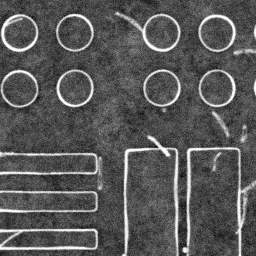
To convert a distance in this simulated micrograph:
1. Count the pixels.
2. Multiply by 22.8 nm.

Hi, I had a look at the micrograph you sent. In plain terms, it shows groups of lines, slits or small figures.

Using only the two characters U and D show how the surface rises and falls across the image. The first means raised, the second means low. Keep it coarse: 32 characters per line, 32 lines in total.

DDDDDDDDDDDDDDDDDDDDDDDDDDDDDDDD
DDDDDDDDDDDDDDDDDDDDDDDDDDDDDDDD
DUUUDDDDUUUDDDDDDDDUUUDDDDUUDDDD
UUUUUDDUUUUDDDDDDDUUUUDDDUUUUDDD
UUUUUDDUUUUDDDDDDDUUUUDDDUUUUDDD
DUUUDDDDUUUDDDDDDDDUUUDDDUUUUDDD
DDDDDDDDDDDDDDDDDDDDDDDDDDDDDDDD
DDDDDDDDDDDDDDDDDDDDDDDDDDDDDDDD
DDDDDDDDDDDDDDDDDDDDDDDDDDDDDDDD
DUUUDDDDUUUDDDDDDDDUUUDDDDUUUDDD
UUUUUDDUUUUDDDDDDDUUUUDDDUUUUDDD
UUUUUDDUUUUDDDDDDDUUUUDDDUUUUDDD
DUUUDDDDUUUDDDDDDDDUUUDDDDUUUDDD
DDDDDDDDDDDDDDDDDDDDDDDDDDDDDDDD
DDDDDDDDDDDDDDDDDDDDDDDDDDDDDDDD
DDDDDDDDDDDDDDDDDDDDDDDDDDDDDDDD
DDDDDDDDDDDDDDDDDDDDDDDDDDDDDDDD
DDDDDDDDDDDDDDDDDDDDDDDDDDDDDDDD
DDDDDDDDDDDDDDDDDDDUUDDDDDDDDDDD
UUUUUUUUUUUUDDDDUUUUUUDDUUUUUUDD
UUUUUUUUUUUUDDDDUUUUUUDDUUUUUUDD
UUUUUUUUUUUUDDDDUUUUUUDDUUUUUUDD
DDDDDDDDDDDDDDDDUUUUUUDDUUUUUUDD
DDDDDDDDDDDDDDDDUUUUUUDDUUUUUUDD
UUUUUUUUUUUUDDDDUUUUUUDDUUUUUUDD
UUUUUUUUUUUUDDDDUUUUUUDDUUUUUUDD
DDDDDDDDDDDDDDDDUUUUUUDDUUUUUUDD
DDDDDDDDDDDDDDDDUUUUUUDDUUUUUUDD
DDDDDDDDDDDDDDDDUUUUUUDDUUUUUUDD
UUUUUUUUUUUUDDDDUUUUUUDDUUUUUUDD
UUUUUUUUUUUUDDDDUUUUUUDDUUUUUUDD
DDDDDDDDDDDDDDDDUUUUUUDUUUUUUUDD